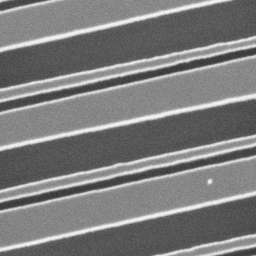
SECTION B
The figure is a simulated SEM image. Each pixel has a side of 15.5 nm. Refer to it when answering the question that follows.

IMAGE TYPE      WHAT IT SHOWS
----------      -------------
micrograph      lines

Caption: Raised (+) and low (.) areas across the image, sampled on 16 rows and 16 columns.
+++++++++++.....
+++++++.........
+++............+
..........++++++
.....+++++++++++
++++++++++++++++
++++++++++++++..
+++++++++.......
++++............
...........+++++
......++++++++++
..++++++++++++++
++++++++++++++..
++++++++++......
+++++...........
+...........++++